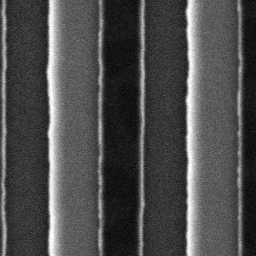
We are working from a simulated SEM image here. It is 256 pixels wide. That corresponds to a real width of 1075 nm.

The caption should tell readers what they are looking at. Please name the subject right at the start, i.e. lines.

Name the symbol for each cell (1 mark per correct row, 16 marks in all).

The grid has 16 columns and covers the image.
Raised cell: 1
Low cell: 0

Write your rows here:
0001111110001111
0001111110001111
0001111110001111
0001111110001111
0001111110001111
0001111110001111
0001111110001111
0001111110001111
0001111110001111
0001111110001111
0001111110001111
0001111110001111
0001111110001111
0001111110001111
0001111110001111
0001111110001111